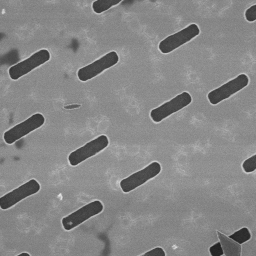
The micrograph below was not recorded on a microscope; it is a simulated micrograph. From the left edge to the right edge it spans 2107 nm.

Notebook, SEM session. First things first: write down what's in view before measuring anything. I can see a regular array of holes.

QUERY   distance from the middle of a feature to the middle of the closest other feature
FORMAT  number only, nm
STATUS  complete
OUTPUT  529